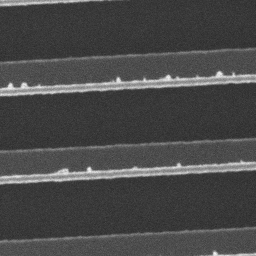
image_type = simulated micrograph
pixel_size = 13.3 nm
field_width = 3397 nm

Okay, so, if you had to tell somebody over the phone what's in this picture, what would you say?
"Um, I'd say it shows lines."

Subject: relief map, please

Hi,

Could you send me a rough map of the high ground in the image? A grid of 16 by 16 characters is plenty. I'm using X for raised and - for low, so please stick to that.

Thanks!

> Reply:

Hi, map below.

----------------
----------------
----------------
-------XXXXXXXXX
XXXXXXXXXXXXXXXX
XXXXXXXXX-------
----------------
----------------
----------------
XXXXXXXXXXXXXXXX
XXXXXXXXXXXXXXXX
----------------
----------------
----------------
-----------XXXXX
XXXXXXXXXXXXXXXX